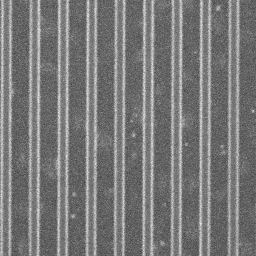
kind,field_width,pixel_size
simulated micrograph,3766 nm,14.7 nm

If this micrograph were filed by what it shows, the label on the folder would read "parallel lines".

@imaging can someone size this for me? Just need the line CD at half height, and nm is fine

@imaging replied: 112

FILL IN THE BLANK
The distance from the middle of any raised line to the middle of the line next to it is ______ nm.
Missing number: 418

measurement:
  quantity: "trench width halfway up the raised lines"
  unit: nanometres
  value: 300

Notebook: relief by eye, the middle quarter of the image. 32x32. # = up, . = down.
#.....##.....##.....##.....##...
#.....##.....##.....##.....##...
#.....##.....##.....##.....##...
#.....##.....##.....##.....##...
#.....##.....##.....##.....##...
#.....##.....##.....##.....##...
#.....##.....##.....##.....##...
#.....##.....##.....##.....##...
#.....##.....##.....##.....##...
#.....##.....##.....##.....##...
#.....##.....##.....##.....##...
#.....##.....##.....##.....##...
#.....##.....##.....##.....##...
#.....##.....##.....##.....##...
#.....##.....##.....##.....##...
#.....##.....##.....##.....##...
#.....##.....##.....##.....##...
#.....##.....##.....##.....##...
#.....##.....##.....##.....##...
#.....##.....##.....##.....##...
#.....##.....##.....##.....##...
#.....##.....##.....##.....##...
#.....##.....##.....##.....##...
#.....##.....##.....##.....##...
#.....##.....##.....##.....##...
#.....##.....##.....##.....##...
#.....##.....##.....##.....##...
#.....##.....##.....##.....##...
#.....##.....##.....##.....##...
#.....##.....##.....##.....##...
#.....##.....##.....##.....##...
#.....##.....##.....##.....##...